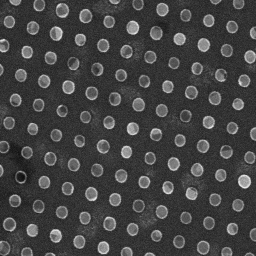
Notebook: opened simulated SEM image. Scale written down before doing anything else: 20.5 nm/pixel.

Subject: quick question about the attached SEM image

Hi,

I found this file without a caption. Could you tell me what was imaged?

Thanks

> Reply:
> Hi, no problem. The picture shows a regular array of raised bodies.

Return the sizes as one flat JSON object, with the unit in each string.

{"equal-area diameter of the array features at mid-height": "235 nanometres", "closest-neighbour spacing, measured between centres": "0.492 um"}